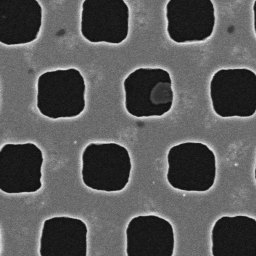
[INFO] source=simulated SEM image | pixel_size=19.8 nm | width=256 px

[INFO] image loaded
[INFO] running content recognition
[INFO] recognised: holes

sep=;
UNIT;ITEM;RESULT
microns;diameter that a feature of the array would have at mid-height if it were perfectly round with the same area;1.02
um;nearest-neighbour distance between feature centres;1.69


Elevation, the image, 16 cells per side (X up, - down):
--XXX---XX---XXX
---XX---XX---XXX
--XXXX--XXX--XXX
XXXXXXXXXXXXXXXX
XXX--XXX--XXXX--
XX---XXX---XX---
XX---XXX---XX---
XXXXXXXXXXXXXXXX
XXXXXXXXXXXXXXXX
---XX---XXX--XXX
---XX---XXX--XXX
--XXX---XXX--XXX
XXXXXXXXXXXXXXXX
XXXXXXXXX-XXXXXX
XXX--XXX---XX---
XXX--XXX---XX---